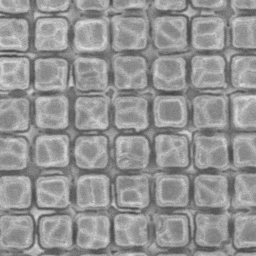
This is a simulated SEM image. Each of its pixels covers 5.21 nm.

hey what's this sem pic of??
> a regular array of raised bodies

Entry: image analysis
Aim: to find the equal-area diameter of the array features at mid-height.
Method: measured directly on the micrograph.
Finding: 181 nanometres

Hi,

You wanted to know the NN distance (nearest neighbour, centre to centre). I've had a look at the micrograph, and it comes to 201 nm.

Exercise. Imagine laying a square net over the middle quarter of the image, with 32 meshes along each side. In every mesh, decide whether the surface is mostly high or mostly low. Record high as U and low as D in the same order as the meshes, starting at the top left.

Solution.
UDDUUUUUUUDDDUUUUUUUDDDUUUUUUUDD
UDDUUUUUUUUDDUUUUUUUDDDUUUUUUUDD
UDDUUUUUUUUDDUUUUUUUDDDUUUUUUUDD
UDDUUUUUUUUDDUUUUUUUDDUUUUUUUUDD
DDDUUUUUUUUDDUUUUUUUDDDUUUUUUUDD
DDDUUUUUUUDDDUUUUUUUDDDUUUUUUUDD
DDDDDDDDDDDDDDDDDDDDDDDDDDDDDDDD
DDDDDDDDDDDDDDDDDDDDDDDDDDDDDDDD
DDDDDDDDDDDDDDUUUUUDDDDUUUUUUUDD
UDDUUUUUUUUDDUUUUUUUUDDUUUUUUUDD
UDDUUUUUUUUDDUUUUUUUUDDUUUUUUUDD
UDDUUUUUUUUDDUUUUUUUUDDUUUUUUUUD
UDDUUUUUUUUDDUUUUUUUUDDUUUUUUUUD
UDDUUUUUUUUDDUUUUUUUUDDUUUUUUUDD
UDDUUUUUUUUDDUUUUUUUUDDUUUUUUUDD
DDDUUUUUUUUDDUUUUUUUUDDDDDDUUUDD
DDDDDDDDDDDDDDDDDDDDDDDDDDDDDDDD
DDDDDDDDDDDDDDDDDDDDDDDDDDDDDDDD
UDDDUUUUUUDDDDUUUUUUDDDUUUUUUUDD
UDDUUUUUUUUDDUUUUUUUUDDUUUUUUUUD
UDDUUUUUUUUDDUUUUUUUUDDUUUUUUUUD
UDDUUUUUUUUDDUUUUUUUUDDUUUUUUUUD
UDDUUUUUUUUDDUUUUUUUUDDUUUUUUUUD
UDDUUUUUUUUDDUUUUUUUUDDUUUUUUUUD
UDDUUUUUUUUDDUUUUUUUUDDUUUUUUUUD
DDDDUUUUUUDDDDUUUUUUUDDDDDDDDUDD
DDDDDDDDDDDDDDDDDDDDDDDDDDDDDDDD
DDDDDDDDDDDDDDDDDDDDDDDDDDDDDDDD
UDDDUUUUUUUDDUUUUUUUDDDUUUUUUUUD
UDDUUUUUUUUDDUUUUUUUUDDUUUUUUUUD
UDDUUUUUUUUDDUUUUUUUUDDUUUUUUUUD
UDDUUUUUUUUDDUUUUUUUUDDUUUUUUUUD